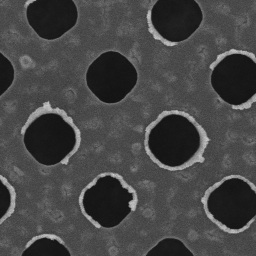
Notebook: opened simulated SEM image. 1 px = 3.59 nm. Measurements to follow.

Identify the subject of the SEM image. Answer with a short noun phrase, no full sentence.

holes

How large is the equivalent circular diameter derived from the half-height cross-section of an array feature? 179 nanometers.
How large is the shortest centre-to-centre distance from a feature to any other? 311 nm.